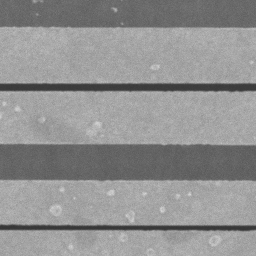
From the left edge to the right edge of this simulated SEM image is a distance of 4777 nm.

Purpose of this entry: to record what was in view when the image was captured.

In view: lines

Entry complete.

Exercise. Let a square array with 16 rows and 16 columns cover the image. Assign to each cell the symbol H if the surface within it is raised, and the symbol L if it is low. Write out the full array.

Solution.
LLLLLLLLLLLLLLLL
LLLLLLLLLLLLLLLL
HHHHHHHHHHHHHHHH
HHHHHHHHHHHHHHHH
HHHHHHHHHHHHHHHH
HHHHHHHHHHHHHHHH
HHHHHHHHHHHHHHHH
HHHHHHHHHHHHHHHH
HHHHHHHHHHHHHHHH
LLLLLLLLLLLLLLLL
LLLLLLLLLLLLLLLL
HHHHHHHHHHHHHHHH
HHHHHHHHHHHHHHHH
HHHHHHHHHHHHHHHH
HHHHHHHHHHHHHHHH
HHHHHHHHHHHHHHHH